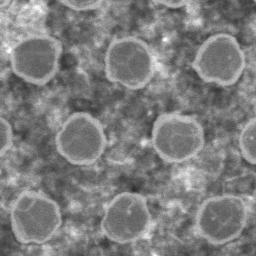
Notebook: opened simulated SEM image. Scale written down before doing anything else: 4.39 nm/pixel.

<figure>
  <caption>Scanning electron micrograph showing a regular array of raised bodies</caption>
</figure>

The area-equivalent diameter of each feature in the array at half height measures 0.206 micrometres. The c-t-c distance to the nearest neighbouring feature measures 0.398 micrometres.